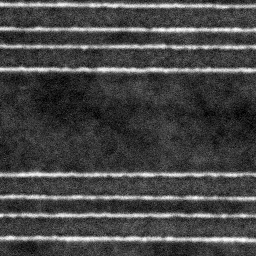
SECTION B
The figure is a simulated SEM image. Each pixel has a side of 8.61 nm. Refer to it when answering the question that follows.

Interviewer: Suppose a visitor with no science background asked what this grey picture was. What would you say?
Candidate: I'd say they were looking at lines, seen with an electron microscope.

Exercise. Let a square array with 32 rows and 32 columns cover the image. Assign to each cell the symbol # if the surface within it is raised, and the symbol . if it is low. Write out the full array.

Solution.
################################
................................
................................
................................
################################
################################
................................
................................
................................
################################
################################
################################
################################
################################
################################
################################
################################
################################
################################
################################
################################
################################
................................
................................
................................
################################
################################
................................
................................
................................
################################
################################